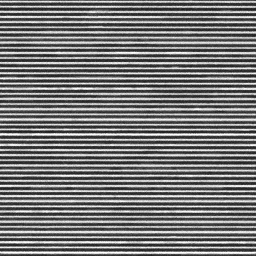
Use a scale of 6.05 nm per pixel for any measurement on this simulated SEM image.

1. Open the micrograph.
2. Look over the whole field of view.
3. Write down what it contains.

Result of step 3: parallel lines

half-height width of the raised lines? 6.1 nm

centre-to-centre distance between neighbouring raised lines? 31 nanometers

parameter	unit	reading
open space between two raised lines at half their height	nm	22.7